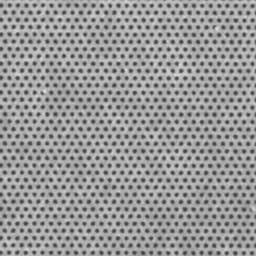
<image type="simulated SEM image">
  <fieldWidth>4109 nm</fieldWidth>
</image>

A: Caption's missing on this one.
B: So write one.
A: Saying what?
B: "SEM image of a regular array of holes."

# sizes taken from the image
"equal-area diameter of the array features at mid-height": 78.9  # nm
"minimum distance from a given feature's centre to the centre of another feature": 127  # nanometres